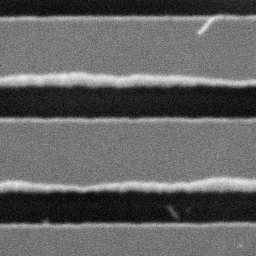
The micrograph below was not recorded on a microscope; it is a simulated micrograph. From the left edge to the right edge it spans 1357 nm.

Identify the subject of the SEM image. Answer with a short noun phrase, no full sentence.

lines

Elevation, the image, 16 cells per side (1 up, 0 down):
0000000000000000
1111111111111111
1111111111111111
1111111111111111
1111111111111111
0000000000000000
0000000000000000
1111111111111111
1111111111111111
1111111111111111
1111111111111111
1111111111111111
0000000000000000
0000000000000000
1111111111111111
1111111111111111